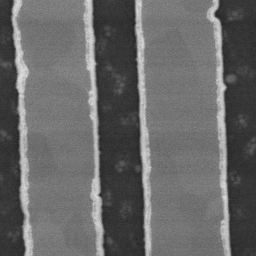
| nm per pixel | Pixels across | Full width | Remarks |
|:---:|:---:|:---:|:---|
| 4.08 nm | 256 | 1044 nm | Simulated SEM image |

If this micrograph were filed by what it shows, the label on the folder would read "one or a few lines or trenches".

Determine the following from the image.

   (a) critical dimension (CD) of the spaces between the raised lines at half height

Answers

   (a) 0.194 micrometres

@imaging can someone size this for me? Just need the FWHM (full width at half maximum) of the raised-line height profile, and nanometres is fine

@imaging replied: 309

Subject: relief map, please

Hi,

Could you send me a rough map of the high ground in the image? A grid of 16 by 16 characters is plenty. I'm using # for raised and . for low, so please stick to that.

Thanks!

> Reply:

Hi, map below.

.#####...####...
.#####...#####..
.#####...#####..
.#####...#####..
.#####...#####..
.#####...#####..
.#####...#####..
.#####...#####..
.#####...#####..
.#####...#####..
.#####...#####..
.#####...#####..
..####...#####..
..####...#####..
..####...#####..
..####...#####..